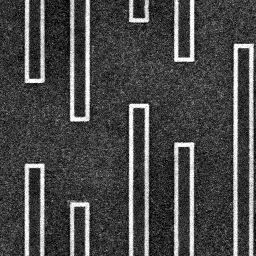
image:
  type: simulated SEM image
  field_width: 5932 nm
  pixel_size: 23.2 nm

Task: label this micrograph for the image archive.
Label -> parallel lines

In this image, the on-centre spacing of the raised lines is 1200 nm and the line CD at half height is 0.385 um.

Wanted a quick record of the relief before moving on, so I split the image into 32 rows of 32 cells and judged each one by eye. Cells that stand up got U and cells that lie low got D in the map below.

DDDUUDDDDUUDDDDDUUDDDDUUDDDDDDDD
DDDUUDDDDUUDDDDDUUDDDDUUDDDDDDDD
DDDUUDDDDUUDDDDDDUDDDDUUDDDDDDDD
DDDUUDDDDUUDDDDDDDDDDDUUDDDDDDDD
DDDUUDDDDUUDDDDDDDDDDDUUDDDDDDDD
DDDUUDDDDUUDDDDDDDDDDDUUDDDDDDDD
DDDUUDDDDUUDDDDDDDDDDDUUDDDDDUUD
DDDUUDDDDUUDDDDDDDDDDDDDDDDDDUUD
DDDUUDDDDUUDDDDDDDDDDDDDDDDDDUUD
DDDUUDDDDUUDDDDDDDDDDDDDDDDDDUUD
DDDDDDDDDUUDDDDDDDDDDDDDDDDDDUUD
DDDDDDDDDUUDDDDDDDDDDDDDDDDDDUUD
DDDDDDDDDUUDDDDDDDDDDDDDDDDDDUUD
DDDDDDDDDUUDDDDDDUDDDDDDDDDDDUUD
DDDDDDDDDUUDDDDDUUDDDDDDDDDDDUUD
DDDDDDDDDDDDDDDDUUDDDDDDDDDDDUUD
DDDDDDDDDDDDDDDDUUDDDDDDDDDDDUUD
DDDDDDDDDDDDDDDDUUDDDDDDDDDDDUUD
DDDDDDDDDDDDDDDDUUDDDDUUDDDDDUUD
DDDDDDDDDDDDDDDDUUDDDDUUDDDDDUUD
DDDDDDDDDDDDDDDDUUDDDDUUDDDDDUUD
DDDUUDDDDDDDDDDDUUDDDDUUDDDDDUUD
DDDUUDDDDDDDDDDDUUDDDDUUDDDDDUUD
DDDUUDDDDDDDDDDDUUDDDDUUDDDDDUUD
DDDUUDDDDDDDDDDDUUDDDDUUDDDDDUUD
DDDUUDDDDDDDDDDDUUDDDDUUDDDDDUUD
DDDUUDDDDUUDDDDDUUDDDDUUDDDDDUUD
DDDUUDDDDUUDDDDDUUDDDDUUDDDDDUUD
DDDUUDDDDUUDDDDDUUDDDDUUDDDDDUUD
DDDUUDDDDUUDDDDDUUDDDDUUDDDDDUUD
DDDUUDDDDUUDDDDDUUDDDDUUDDDDDUUD
DDDUUDDDDUUDDDDDUUDDDDUUDDDDDUUD